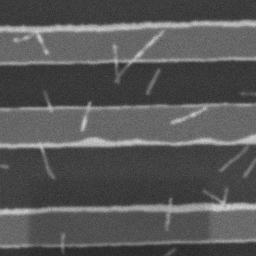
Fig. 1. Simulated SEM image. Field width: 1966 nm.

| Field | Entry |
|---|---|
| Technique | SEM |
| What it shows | lines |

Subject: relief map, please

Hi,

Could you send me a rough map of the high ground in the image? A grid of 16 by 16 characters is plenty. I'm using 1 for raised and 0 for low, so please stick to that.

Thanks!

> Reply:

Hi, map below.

0000000000000000
0000000000001111
1111111111111111
1111111111111111
0000000000000000
0000000000000000
0000000000000010
1111111111111111
1111111111111111
0000000000000000
0000000000000000
0000000000000000
0000000000000000
1111111111111111
1111111111111111
0000000000000000